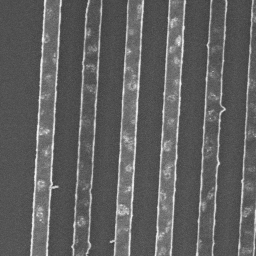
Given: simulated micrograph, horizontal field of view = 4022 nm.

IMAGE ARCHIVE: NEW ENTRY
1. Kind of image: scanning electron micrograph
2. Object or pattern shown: parallel lines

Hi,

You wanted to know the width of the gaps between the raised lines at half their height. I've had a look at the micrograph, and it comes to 408 nm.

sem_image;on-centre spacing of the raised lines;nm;651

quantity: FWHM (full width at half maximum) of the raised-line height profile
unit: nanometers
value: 241